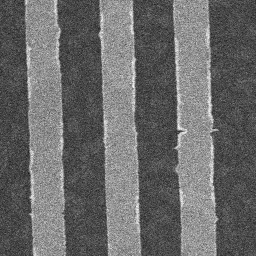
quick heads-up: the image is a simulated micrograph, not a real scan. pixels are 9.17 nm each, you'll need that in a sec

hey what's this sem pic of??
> one or a few lines or trenches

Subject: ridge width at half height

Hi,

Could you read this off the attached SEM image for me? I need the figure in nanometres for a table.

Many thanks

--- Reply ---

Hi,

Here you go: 294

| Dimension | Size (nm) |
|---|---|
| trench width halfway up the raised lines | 385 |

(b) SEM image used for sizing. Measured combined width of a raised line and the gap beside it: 684 nm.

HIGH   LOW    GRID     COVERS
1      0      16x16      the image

0011001100011000
0011001100011000
0011001100011000
0011001100011000
0011001100011000
0011001100011000
0011001100011000
0011000100011000
0011001100011000
0011000110011000
0011000110011000
0011000110011000
0011000110011000
0011000110011000
0011000110011000
0011000110011000